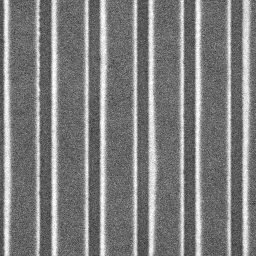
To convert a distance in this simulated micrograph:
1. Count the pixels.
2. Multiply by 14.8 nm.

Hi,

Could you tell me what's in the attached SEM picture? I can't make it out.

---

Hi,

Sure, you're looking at lines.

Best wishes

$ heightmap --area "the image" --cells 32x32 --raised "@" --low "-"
-@@@@--@@@@--@@@@--@@@@--@@@@--@
-@@@@--@@@@--@@@@--@@@@--@@@@--@
-@@@@--@@@@--@@@@--@@@@--@@@@--@
-@@@@--@@@@--@@@@--@@@@--@@@@--@
-@@@@--@@@@--@@@@--@@@@--@@@@--@
-@@@@--@@@@--@@@@--@@@@--@@@@--@
-@@@@--@@@@--@@@@--@@@@--@@@@--@
-@@@@--@@@@--@@@@--@@@@--@@@@--@
-@@@@--@@@@--@@@@--@@@@--@@@@--@
-@@@@--@@@@--@@@@--@@@@--@@@@--@
-@@@@--@@@@--@@@@--@@@@--@@@@--@
-@@@@--@@@@--@@@@--@@@@--@@@@--@
-@@@@--@@@@--@@@@--@@@@--@@@@--@
-@@@@--@@@@--@@@@--@@@@--@@@@--@
-@@@@--@@@@--@@@@--@@@@--@@@@--@
-@@@@--@@@@--@@@@--@@@@--@@@@--@
-@@@@--@@@@--@@@@--@@@@--@@@@--@
-@@@@--@@@@--@@@@--@@@@--@@@@--@
-@@@@--@@@@--@@@@--@@@@--@@@@--@
-@@@@--@@@@--@@@@--@@@@--@@@@--@
-@@@@--@@@@--@@@@--@@@@--@@@@--@
-@@@@--@@@@--@@@@--@@@@--@@@@--@
-@@@@--@@@@--@@@@--@@@@--@@@@--@
-@@@@--@@@@--@@@@--@@@@--@@@@--@
-@@@@--@@@@--@@@@--@@@@--@@@@--@
-@@@@--@@@@--@@@@--@@@@--@@@@--@
-@@@@--@@@@--@@@@--@@@@--@@@@--@
-@@@@--@@@@--@@@@--@@@@--@@@@--@
-@@@@--@@@@--@@@@--@@@@--@@@@--@
-@@@@--@@@@--@@@@--@@@@--@@@@--@
-@@@@--@@@@--@@@@--@@@@--@@@@--@
-@@@@--@@@@--@@@@--@@@@--@@@@--@